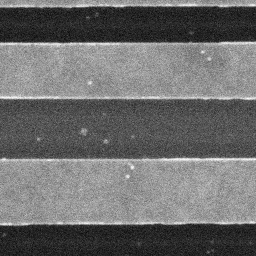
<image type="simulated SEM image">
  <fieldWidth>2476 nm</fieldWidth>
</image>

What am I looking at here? lines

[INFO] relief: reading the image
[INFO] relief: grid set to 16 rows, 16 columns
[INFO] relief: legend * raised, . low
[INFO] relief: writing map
................
................
................
****************
****************
****************
................
................
................
................
****************
****************
****************
****************
................
................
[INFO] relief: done